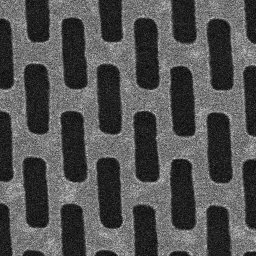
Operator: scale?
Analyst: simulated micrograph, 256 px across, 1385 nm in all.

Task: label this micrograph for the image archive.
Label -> a regular array of holes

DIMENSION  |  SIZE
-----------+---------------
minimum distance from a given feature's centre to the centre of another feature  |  313 nanometers